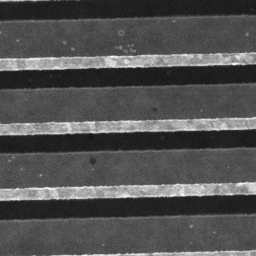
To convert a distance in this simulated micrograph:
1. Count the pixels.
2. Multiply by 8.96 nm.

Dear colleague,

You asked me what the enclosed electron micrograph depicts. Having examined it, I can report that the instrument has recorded lines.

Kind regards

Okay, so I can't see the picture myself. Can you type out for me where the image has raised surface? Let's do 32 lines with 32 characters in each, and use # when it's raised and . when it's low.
................................
................................
.......#########################
################################
################################
################################
################################
################################
#############...................
................................
..............................##
################################
################################
################################
################################
################################
##############.#................
................................
..............................##
################################
################################
################################
################################
################################
######################..........
................................
................................
...#############################
################################
################################
################################
################################